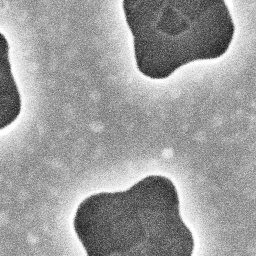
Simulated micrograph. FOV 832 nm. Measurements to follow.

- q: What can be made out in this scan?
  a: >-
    holes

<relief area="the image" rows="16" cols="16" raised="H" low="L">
HHHHHHHHLLLLLLHH
HHHHHHHHLLLLLLLH
HHHHHHHHLLLLLLLH
LHHHHHHHLLLLLLHH
LHHHHHHHHLLHHHHH
LHHHHHHHHHHHHHHH
LHHHHHHHHHHHHHHH
LHHHHHHHHHHHHHHH
HHHHHHHHHHHHHHHH
HHHHHHHHHHHHHHHH
HHHHHHHHHHHHHHHH
HHHHHHHHLLLHHHHH
HHHHHLLLLLLHHHHH
HHHHHLLLLLLHHHHH
HHHHHLLLLLLLHHHH
HHHHHLLLLLLLHHHH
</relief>